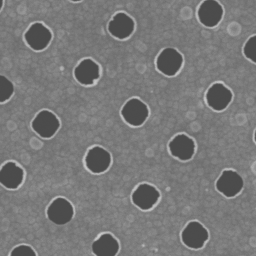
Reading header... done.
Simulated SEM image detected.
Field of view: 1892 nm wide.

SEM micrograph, a regular array of holes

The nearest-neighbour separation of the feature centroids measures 441 nanometres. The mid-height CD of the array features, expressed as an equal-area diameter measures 25.2 px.